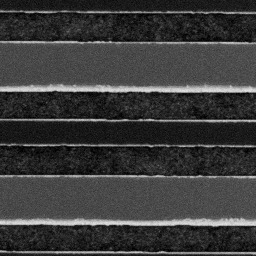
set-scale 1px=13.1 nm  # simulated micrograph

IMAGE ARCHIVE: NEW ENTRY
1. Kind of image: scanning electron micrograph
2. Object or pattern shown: lines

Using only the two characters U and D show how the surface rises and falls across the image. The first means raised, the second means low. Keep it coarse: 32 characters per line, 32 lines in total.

UUUUUUUUUUUUUUUUUUUUUUUUUUUUUUUU
DDDUUUUDDUUUUUUUUUUUUUUUUUUUUUUU
DDDDDDDDDDDDDDDDDDDDDDDDDDDDDDDD
DDDDDDDDDDDDDDDDDDDDDDDDDDDDDDDD
DDDDDDDDDDDDDDDDDDDDDDDDDDDDDDDD
UUUUUUUUUUUUUUUUUUUUUUUUUUUUUUUU
UUUUUUUUUUUUUUUUUUUUUUUUUUUUUUUU
UUUUUUUUUUUUUUUUUUUUUUUUUUUUUUUU
UUUUUUUUUUUUUUUUUUUUUUUUUUUUUUUU
UUUUUUUUUUUUUUUUUUUUUUUUUUUUUUUU
UUUUUUUUUUUUUUUUUUUUUUUUUUUUUUUU
DDDDDDDDDDDDDDDDDDDDDDDDDDDDDDDD
DDDDDDDDDDDDDDDDDDDDDDDDDDDDDDDD
DDDDDDDDDDDDDDDDDDDDDDDDDDDDDDDD
DDDDDDDDDDDDDDDDDDDDDDDDDDDDDDDD
UUUUUUUUUUUUUUUUUUUUUUUUUUUUUUUU
UUUUUUUUUUUUUUUUUUUUUUUUUUUUUUUU
UUUUUUUUUUUUUUUUUUUUUUUUUUUUUUUU
DDDDDDDDDDDDDDDDDDDDDDDDDDDDDDDD
DDDDDDDDDDDDDDDDDDDDDDDDDDDDDDDD
DDDDDDDDDDDDDDDDDDDDDDDDDDDDDDDD
DDDDDDDDDDDDDDDDDDDDDDDDDDDDDDDD
UUUUUUUUUUUUUUUUUUUUUUUUUUUUUUUU
UUUUUUUUUUUUUUUUUUUUUUUUUUUUUUUU
UUUUUUUUUUUUUUUUUUUUUUUUUUUUUUUU
UUUUUUUUUUUUUUUUUUUUUUUUUUUUUUUU
UUUUUUUUUUUUUUUUUUUUUUUUUUUUUUUU
UUUUUUUUUUUUUUUUUUUUUUUUUUUUUUUU
DDDDDDDDDDDDDDDDDDDDDDDDDDDDDDDD
DDDDDDDDDDDDDDDDDDDDDDDDDDDDDDDD
DDDDDDDDDDDDDDDDDDDDDDDDDDDDDDDD
DDDDDDDDDDDDDDDDDDDDDDDDDDDDDDDD